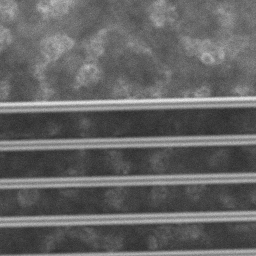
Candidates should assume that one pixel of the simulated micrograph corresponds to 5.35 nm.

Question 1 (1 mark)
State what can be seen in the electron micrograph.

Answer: parallel lines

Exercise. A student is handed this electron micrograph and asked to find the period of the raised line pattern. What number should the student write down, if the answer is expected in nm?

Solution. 203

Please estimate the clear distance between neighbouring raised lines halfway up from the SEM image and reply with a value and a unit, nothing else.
163 nm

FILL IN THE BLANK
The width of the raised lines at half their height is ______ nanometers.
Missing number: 38.8